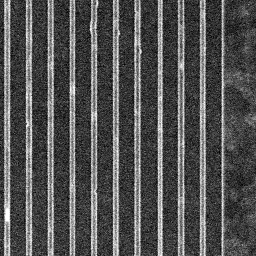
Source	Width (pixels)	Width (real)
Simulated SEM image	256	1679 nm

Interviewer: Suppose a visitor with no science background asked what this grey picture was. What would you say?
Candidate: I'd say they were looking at parallel lines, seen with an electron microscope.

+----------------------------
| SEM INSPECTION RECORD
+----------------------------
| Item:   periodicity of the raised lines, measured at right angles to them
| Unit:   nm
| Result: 142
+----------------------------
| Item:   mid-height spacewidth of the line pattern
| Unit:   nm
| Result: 107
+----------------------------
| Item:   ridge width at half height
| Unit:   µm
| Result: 0.0328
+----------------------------